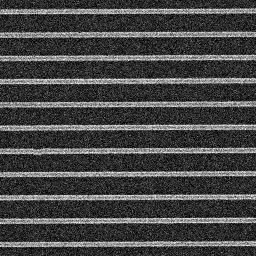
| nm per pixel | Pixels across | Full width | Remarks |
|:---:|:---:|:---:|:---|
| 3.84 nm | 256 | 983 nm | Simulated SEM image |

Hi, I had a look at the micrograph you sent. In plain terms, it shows parallel lines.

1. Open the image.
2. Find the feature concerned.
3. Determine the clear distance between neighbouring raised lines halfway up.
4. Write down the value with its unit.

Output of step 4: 71.6 nm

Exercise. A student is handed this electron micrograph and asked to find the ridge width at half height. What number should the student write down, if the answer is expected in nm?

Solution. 17.8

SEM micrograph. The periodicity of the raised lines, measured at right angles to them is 89.4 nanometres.